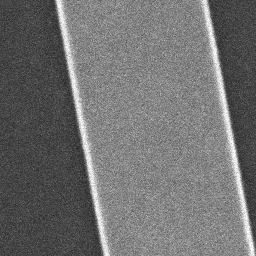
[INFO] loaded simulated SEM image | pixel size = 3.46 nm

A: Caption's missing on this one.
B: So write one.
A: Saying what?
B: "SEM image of one or a few lines or trenches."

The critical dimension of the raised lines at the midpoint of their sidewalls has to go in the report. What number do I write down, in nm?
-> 504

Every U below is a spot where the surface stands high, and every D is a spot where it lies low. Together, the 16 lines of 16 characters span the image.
DDDDUUUUUUUUUDDD
DDDDUUUUUUUUUDDD
DDDDUUUUUUUUUDDD
DDDDUUUUUUUUUUDD
DDDDUUUUUUUUUUDD
DDDDDUUUUUUUUUDD
DDDDDUUUUUUUUUDD
DDDDDUUUUUUUUUDD
DDDDDUUUUUUUUUDD
DDDDDUUUUUUUUUUD
DDDDDDUUUUUUUUUD
DDDDDDUUUUUUUUUD
DDDDDDUUUUUUUUUD
DDDDDDUUUUUUUUUD
DDDDDDUUUUUUUUUU
DDDDDDDUUUUUUUUU